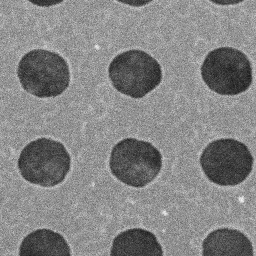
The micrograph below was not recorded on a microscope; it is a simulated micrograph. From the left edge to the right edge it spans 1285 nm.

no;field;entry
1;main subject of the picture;holes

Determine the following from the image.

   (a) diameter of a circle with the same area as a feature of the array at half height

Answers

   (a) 255 nanometers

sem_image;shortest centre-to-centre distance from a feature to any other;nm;446